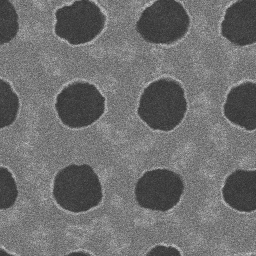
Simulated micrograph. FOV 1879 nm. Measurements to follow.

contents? holes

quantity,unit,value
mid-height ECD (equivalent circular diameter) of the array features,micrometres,0.348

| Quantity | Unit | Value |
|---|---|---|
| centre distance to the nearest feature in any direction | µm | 0.602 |